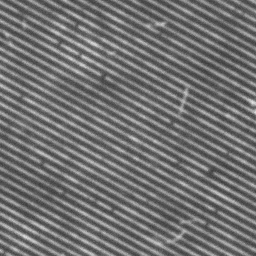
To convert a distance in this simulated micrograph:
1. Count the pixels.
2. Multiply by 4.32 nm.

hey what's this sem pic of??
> parallel lines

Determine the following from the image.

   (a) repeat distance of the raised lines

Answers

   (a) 34.9 nanometres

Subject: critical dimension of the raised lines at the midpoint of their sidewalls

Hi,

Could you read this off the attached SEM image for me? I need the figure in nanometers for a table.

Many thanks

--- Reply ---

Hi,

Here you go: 8.6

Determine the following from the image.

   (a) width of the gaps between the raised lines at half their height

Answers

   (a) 0.0266 µm